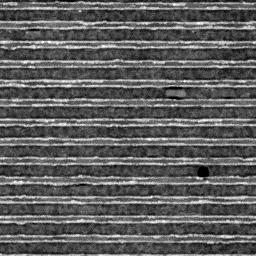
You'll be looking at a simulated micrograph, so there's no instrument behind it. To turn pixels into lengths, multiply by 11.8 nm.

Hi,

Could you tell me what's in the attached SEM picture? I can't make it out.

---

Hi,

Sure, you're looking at parallel lines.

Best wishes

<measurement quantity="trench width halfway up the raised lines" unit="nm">153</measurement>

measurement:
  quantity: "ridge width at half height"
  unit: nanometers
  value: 72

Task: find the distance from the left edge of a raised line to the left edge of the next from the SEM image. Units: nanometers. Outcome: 228